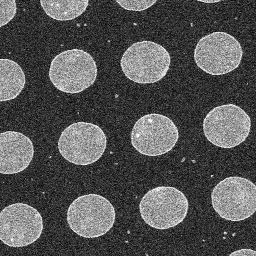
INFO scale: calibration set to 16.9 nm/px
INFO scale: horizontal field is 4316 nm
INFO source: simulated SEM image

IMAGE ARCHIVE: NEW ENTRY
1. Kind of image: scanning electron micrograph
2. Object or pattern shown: a regular array of raised bodies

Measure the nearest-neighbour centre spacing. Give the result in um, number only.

1.23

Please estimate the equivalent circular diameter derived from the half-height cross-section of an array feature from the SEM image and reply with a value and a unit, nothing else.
758 nanometers